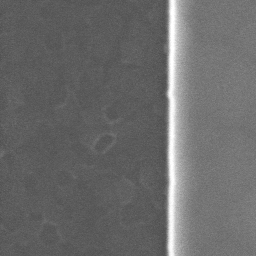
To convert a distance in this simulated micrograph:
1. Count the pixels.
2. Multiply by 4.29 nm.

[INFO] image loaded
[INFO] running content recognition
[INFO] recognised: one or a few lines or trenches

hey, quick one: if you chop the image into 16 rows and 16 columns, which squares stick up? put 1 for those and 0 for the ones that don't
0000000000011111
0000000000011111
0000000000011111
0000000000011111
0000000000011111
0000000000011111
0000000000011111
0000000000011111
0000000000011111
0000000000011111
0000000000011111
0000000000011111
0000000000011111
0000000000011111
0000000000011111
0000000000011111